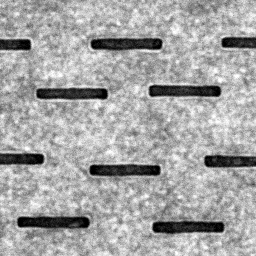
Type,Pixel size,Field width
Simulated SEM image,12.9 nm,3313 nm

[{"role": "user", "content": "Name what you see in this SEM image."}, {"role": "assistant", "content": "holes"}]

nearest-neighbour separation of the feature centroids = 1030 nanometres